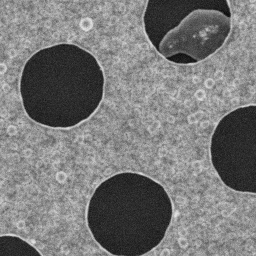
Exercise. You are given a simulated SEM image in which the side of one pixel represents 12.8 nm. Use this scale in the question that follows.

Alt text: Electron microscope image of holes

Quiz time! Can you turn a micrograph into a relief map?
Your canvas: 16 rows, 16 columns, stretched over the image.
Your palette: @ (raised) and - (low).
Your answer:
@@@@@@@@@-----@@
@@@@@@@@@-----@@
@@@@@@@@@-----@@
@@----@@@@---@@@
@-----@@@@@@@@@@
@-----@@@@@@@@@@
@-----@@@@@@@@@@
@@---@@@@@@@@@--
@@@@@@@@@@@@@---
@@@@@@@@@@@@@---
@@@@@@@@@@@@@---
@@@@@@----@@@@--
@@@@@@-----@@@@@
@@@@@------@@@@@
@@@@@@----@@@@@@
--@@@@----@@@@@@